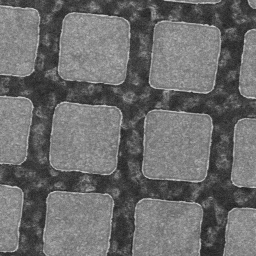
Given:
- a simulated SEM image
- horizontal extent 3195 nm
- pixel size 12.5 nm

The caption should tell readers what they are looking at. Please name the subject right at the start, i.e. raised bodies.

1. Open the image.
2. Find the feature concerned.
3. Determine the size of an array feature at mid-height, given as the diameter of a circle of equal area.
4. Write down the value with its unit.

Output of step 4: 75.4 px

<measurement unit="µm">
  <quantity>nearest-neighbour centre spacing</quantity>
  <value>1.12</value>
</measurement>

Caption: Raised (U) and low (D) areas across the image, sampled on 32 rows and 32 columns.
DDDDDDDDDDDDDDDDDDDDDDDDDDDDDDDU
UUUUUDDDDDDDDDDDDDDDDDDDDDDDDDDD
UUUUUDDDUUUUUUUUDDDDDDDDDDDDDDDD
UUUUUDDDUUUUUUUUDDDUUUUUUUUDDDDD
UUUUUDDDUUUUUUUUDDDUUUUUUUUUDDDU
UUUUUDDUUUUUUUUUDDDUUUUUUUUUDDDU
UUUUUDDUUUUUUUUUDDDUUUUUUUUDDDUU
UUUUDDDUUUUUUUUUDDDUUUUUUUUDDDUU
UUUUDDDUUUUUUUUUDDDUUUUUUUUDDDUU
DDUDDDDDUUUUUUUUDDDUUUUUUUUDDDUU
DDDDDDDDDDDDDDUDDDDUUUUUUUUDDDUU
DDDDDDDDDDDDDDDDDDDDDDDDUUDDDDUU
UUUUDDDDDDDDDDDDDDDDDDDDDDDDDDDD
UUUUDDDUUUUUUUUDDDDDDDDDDDDDDDDD
UUUUDDDUUUUUUUUDDDUUUUUUUUDDDDDD
UUUUDDDUUUUUUUUDDDUUUUUUUUUDDDUU
UUUUDDUUUUUUUUUDDDUUUUUUUUDDDUUU
UUUDDDUUUUUUUUUDDDUUUUUUUUDDDUUU
UUUDDDUUUUUUUUUDDDUUUUUUUUDDDUUU
UUUDDDUUUUUUUUUDDDUUUUUUUUDDDUUU
DDDDDDUUUUUUUUUDDDUUUUUUUUDDDUUU
DDDDDDDDDDDUUUDDDDUUUUUUUUDDDUUU
DDDDDDDDDDDDDDDDDDDDDDUUUDDDDUUU
UUDDDDDDDDDDDDDDDDDDDDDDDDDDDDDD
UUUDDDUUUUUUUUDDDDDDDDDDDDDDDDDD
UUUDDDUUUUUUUUDDDUUUUUUUUDDDDDDD
UUUDDDUUUUUUUUDDDUUUUUUUUDDDDUUU
UUUDDDUUUUUUUUDDDUUUUUUUUDDDUUUU
UUDDDDUUUUUUUUDDDUUUUUUUUDDDUUUU
UUDDDUUUUUUUUUDDDUUUUUUUUDDDUUUU
UUDDDDUUUUUUUUDDDUUUUUUUUDDDUUUU
DDDDDDUUUUUUUDDDDUUUUUUUUDDDUUUU